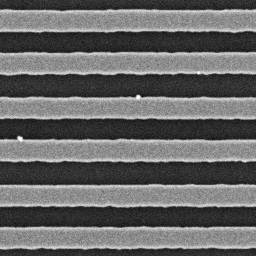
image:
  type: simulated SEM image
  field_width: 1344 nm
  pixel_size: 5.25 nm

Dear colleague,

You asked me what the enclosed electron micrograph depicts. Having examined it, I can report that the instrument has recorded lines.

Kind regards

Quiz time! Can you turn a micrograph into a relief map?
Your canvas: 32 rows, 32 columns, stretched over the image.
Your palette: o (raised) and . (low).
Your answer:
................................
oooooooooooooooooooooooooooooooo
oooooooooooooooooooooooooooooooo
oooooooooooooooooooooooooooooooo
................................
................................
................................
oooooooooooooooooooooooooooooooo
oooooooooooooooooooooooooooooooo
................................
................................
................................
oooooooooooooooooooooooooooooooo
oooooooooooooooooooooooooooooooo
oooooooooooooooooooooooooooooooo
................................
................................
o.o...o.......oo................
oooooooooooooooooooooooooooooooo
oooooooooooooooooooooooooooooooo
................................
................................
................................
oooooooooooooooooooooooooooooooo
oooooooooooooooooooooooooooooooo
oooooooooooooooooooooooooooooooo
................................
................................
oo.ooooooooooooooooooooooooooooo
oooooooooooooooooooooooooooooooo
oooooooooooooooooooooooooooooooo
................................